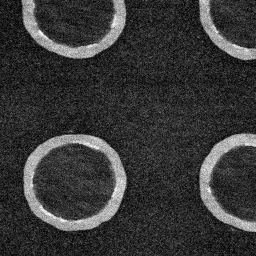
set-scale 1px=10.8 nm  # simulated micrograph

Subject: raised bodies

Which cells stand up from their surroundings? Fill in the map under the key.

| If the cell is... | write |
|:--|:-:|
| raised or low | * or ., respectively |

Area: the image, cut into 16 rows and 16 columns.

..******.....***
..*****......***
...****.......**
................
................
................
................
................
................
...****.......**
..*****......***
..******.....***
..*****......***
...****.......**
................
................